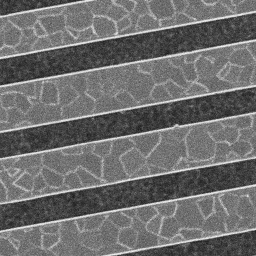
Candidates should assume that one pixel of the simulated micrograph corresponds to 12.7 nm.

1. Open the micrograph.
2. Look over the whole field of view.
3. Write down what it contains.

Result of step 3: one or a few lines or trenches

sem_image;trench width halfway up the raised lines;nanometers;350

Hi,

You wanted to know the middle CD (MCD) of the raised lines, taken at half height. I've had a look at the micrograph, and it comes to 563 nanometres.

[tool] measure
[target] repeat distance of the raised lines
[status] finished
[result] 901 nm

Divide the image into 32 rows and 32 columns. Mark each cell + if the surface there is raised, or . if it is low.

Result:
.........+++++++++++++++++++++++
...+++++++++++++++++++++++++++++
++++++++++++++++++++++++++......
+++++++++++++++++++++...........
+++++++++++++++.................
++++++++++...................+++
++++....................++++++++
..................++++++++++++++
.............+++++++++++++++++++
.......+++++++++++++++++++++++++
..++++++++++++++++++++++++++++++
+++++++++++++++++++++++++++.....
++++++++++++++++++++++..........
+++++++++++++++++...............
+++++++++++...................++
++++++..................++++++++
...................+++++++++++++
.............+++++++++++++++++++
........++++++++++++++++++++++++
..++++++++++++++++++++++++++++++
+++++++++++++++++++++++++++.....
++++++++++++++++++++++..........
++++++++++++++++................
+++++++++++...................++
+++++....................+++++++
...................+++++++++++++
.............+++++++++++++++++++
........++++++++++++++++++++++++
..++++++++++++++++++++++++++++++
+++++++++++++++++++++++++++.....
++++++++++++++++++++++..........
++++++++++++++++................